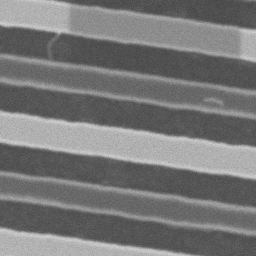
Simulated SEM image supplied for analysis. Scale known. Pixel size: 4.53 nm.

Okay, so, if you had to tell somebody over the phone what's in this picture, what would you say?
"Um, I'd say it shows lines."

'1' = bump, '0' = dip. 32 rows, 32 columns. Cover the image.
11111111100000000000000000000000
11111111111111111000000000000000
11111111111111111111111100000000
00011111111111111111111111111100
00000000001111111111111111111111
00000000000000000111111111111111
00000000000000000000000001111111
11111000000000000000000000000001
11111111111110000000000000000000
11111111111111111110000000000000
00111111111111111111111111000000
00000000111111111111111111111111
00000000000000001111111111111111
00000000000000000000001111111111
11110000000000000000000000000011
11111111111000000000000000000000
11111111111111111110000000000000
11111111111111111111111110000000
00000111111111111111111111111111
00000000000001111111111111111111
00000000000000000001111111111111
00000000000000000000000001111111
11111111000000000000000000000000
11111111111111100000000000000000
11111111111111111111110000000000
00000111111111111111111111110000
00000000000111111111111111111111
00000000000000000001111111111111
00000000000000000000000000111111
11111110000000000000000000000000
11111111111111000000000000000000
11111111111111111111100000000000